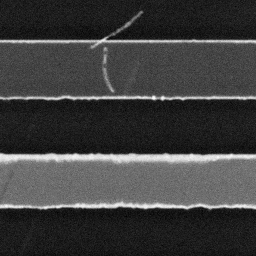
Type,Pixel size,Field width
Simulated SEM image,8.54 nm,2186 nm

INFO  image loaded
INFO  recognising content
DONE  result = lines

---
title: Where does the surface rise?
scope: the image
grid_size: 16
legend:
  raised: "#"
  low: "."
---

................
................
......#.........
################
################
################
................
................
................
................
################
################
################
................
................
................